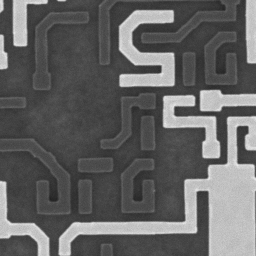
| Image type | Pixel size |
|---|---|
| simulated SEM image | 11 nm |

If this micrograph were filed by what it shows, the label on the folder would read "wiring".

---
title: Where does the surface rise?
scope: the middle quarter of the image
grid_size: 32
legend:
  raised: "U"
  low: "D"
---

DDDDDDDDDDDDDDDDDDDDDDDDUUUDDDUU
DDDDDDDDDDDDDDDDDDDDDDDDDUUDDDUU
DDDDDDDDDDDDDDDDDDDDDDDUUUUDDDUU
DDDDDDDDDDDDDDUUUUUUUUUUUUUDDDUU
DDDDDDDDDDDDDDUUUUUUUUUUUUUDDDUU
DDDDDDDDDDDDDDDDDDDDDDDDDDDDDDDD
DDDDDDDDDDDDDDDDDDDDDDDDDDDDDDDD
DDDDDDDDDDDDDDDDDDDUUUUDDDDDDDDD
DDDDDDDDDDDDDDDUUUUUUUUDDUUUUUUU
DDDDDDDDDDDDDDUUUUUUUUUDDUUUUUUU
DDDDDDDDDDDDDDDUUDUUUUUDDUUUDDDD
DDDDDDDDDDDDDDDUUDDDDDDDDUUDDDDD
DDDDDDDDDDDDDDDUUDDDDDDDDUUDDDDD
DDDDDDDDDDDDDDDUUDDUUUDDDUUUUUUU
DDDDDDDDDDDDDDDUUDDUUUDDDUUUUUUU
DDDDDDDDDDDDDDDUUDDUUUDDDUUUUUUU
DDDDDDDDDDDDDDUUUDDUUUDDDDDDDDDD
DDDDDDDDDDDDDDUUUDDUUUDDDDDDDDDD
DDDDDDDDDDDDDUUUDDDUUUDDDDDDDDDD
DDDDDDDDDUUUUUUDDDDUUUUDDDDDDDDD
DDDDDDDDDUUUUUDDDDDUUUUDDDDDDDDD
DDDDDDDDDDDDDDDDDDDDDDDDDDDDDDDD
DDDDDDDDDDDDDDDDDDDDDDDDDDDDDDDD
DDDDDDDDDDDDDDDDDDDDDDDDDDDDDDDD
DDDDUUUUUUUUDDDDDUUUUUDDDDDDDDDD
DDDDUUUUUUUUDDDDUUUUUUDDDDDDDDDD
DDDDUUUUUUUUDDDUUUUDDDDDDDDDDDDD
UDDDDDDDDDDDDDUUUUDDDDDDDDDDDDDD
UDDDDDDDDDDDDDUUUDDDDDDDDDDDDDDD
UDDDUUUDDDDDDDDUUDDDUUDDDDDDDDUU
UDDDUUUDDDDDDDDUUDDDUUDDDDDDDDUU
UDDDUUUDDDDDDDDUUDDDUUDDDDDDDDUU